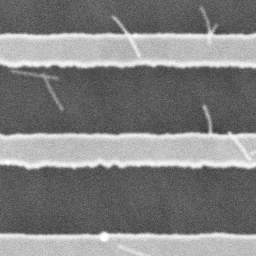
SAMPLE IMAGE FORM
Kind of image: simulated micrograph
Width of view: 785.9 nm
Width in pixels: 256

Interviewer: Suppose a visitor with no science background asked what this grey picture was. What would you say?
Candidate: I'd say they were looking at lines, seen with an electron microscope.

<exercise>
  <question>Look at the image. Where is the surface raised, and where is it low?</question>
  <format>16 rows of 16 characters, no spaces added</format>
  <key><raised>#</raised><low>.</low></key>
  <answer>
................
................
################
################
................
................
................
................
################
################
................
................
................
................
................
################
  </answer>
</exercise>